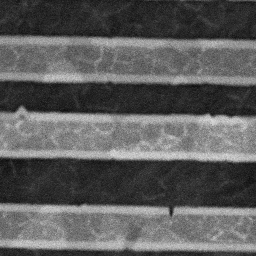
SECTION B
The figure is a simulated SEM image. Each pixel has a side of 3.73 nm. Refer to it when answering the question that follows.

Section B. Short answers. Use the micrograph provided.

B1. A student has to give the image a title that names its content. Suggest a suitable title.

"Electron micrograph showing one or a few lines or trenches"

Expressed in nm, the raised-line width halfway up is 138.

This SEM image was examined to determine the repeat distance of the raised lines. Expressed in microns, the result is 0.312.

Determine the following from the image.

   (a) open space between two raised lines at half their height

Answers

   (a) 172 nanometers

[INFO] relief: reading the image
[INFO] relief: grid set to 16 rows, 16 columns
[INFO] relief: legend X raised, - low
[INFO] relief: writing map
----------------
----------------
----------------
XXXXXXXXXXXXXXXX
XXXXXXXXXXXXXXXX
----------------
----------------
XXXXXXXXXXXXX---
XXXXXXXXXXXXXXXX
XXXXXXXXXXXXXXXX
----------------
----------------
----------------
XXXXXXXXXXXXXXXX
XXXXXXXXXXXXXXXX
----------------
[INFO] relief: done